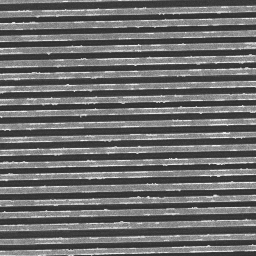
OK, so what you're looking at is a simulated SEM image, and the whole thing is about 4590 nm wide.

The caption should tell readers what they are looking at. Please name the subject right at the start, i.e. parallel lines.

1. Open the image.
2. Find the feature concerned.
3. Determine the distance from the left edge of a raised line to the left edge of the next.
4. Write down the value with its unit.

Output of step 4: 226 nanometres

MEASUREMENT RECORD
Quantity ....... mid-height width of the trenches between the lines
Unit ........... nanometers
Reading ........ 105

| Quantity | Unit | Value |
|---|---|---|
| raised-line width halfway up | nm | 123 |